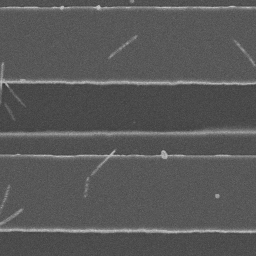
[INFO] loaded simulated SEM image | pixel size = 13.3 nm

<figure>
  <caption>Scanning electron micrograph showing lines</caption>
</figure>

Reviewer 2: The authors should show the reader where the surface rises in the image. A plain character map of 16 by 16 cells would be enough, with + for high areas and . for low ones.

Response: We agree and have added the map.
++++++++++++++++
++++++++++++++++
++++++++++++++++
++++++++++++++++
++++++++++++++++
................
................
................
++++++++++++++++
++++++++++++++++
++++++++++++++++
++++++++++++++++
++++++++++++++++
++++++++++++++++
................
................